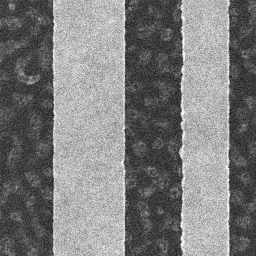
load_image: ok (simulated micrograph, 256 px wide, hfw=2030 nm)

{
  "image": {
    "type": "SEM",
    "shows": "one or a few lines or trenches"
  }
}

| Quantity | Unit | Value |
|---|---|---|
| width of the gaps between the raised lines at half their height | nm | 459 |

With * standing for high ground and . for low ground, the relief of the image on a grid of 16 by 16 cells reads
...*****...***..
...*****...***..
...*****...***..
...*****...***..
...*****...***..
...*****...***..
...*****...***..
...*****...***..
...*****...***..
...*****...***..
...*****...***..
...*****...***..
...*****...***..
...*****...***..
...*****...***..
...*****...***..